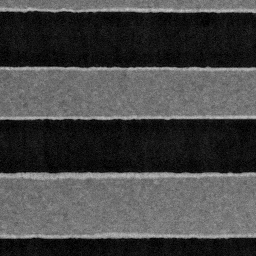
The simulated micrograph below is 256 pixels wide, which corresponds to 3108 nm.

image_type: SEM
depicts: lines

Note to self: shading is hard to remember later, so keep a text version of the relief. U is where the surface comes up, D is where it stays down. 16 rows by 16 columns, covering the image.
UUUUUUUUUUUUUUUU
DDDDDDDDDDDDDDDD
DDDDDDDDDDDDDDDD
DDDDDDDDDDDDDDDD
UUUUUUUUUUUUUUUU
UUUUUUUUUUUUUUUU
UUUUUUUUUUUUUUUU
DDDDDDDDDDDDDDDD
DDDDDDDDDDDDDDDD
DDDDDDDDDDDDDDDD
DDDDDDDDDDDDDDDD
UUUUUUUUUUUUUUUU
UUUUUUUUUUUUUUUU
UUUUUUUUUUUUUUUU
UUUUUUUUUUUUUUUU
DDDDDDDDDDDDDDDD